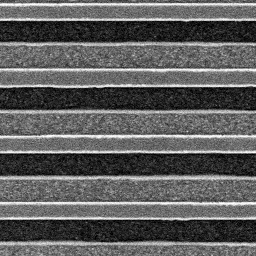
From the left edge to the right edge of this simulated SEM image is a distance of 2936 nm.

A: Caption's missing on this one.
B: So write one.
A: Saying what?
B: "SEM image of lines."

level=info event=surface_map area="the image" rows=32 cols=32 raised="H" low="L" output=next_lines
HHHHHHHHHHHHHHHHHHHHHHHHHHHHHHHH
HHHHHHHHHHHHHHHHHHHHHHHHHHHHHHHH
HHHHHHHHHHHHHHHHHHHHHHHHHHHHHHHH
LLLLLLLLLLLLLLLLLLLLLLLLLLLLLLLL
LLLLLLLLLLLLLLLLLLLLLLLLLLLLLLLL
LLLLLLLLLLLLLLLLLLLLLLLLLLLLLLLL
HHHHHHHHHHHHHHHHHHHHHHHHHHHHHHHH
HHHHHHHHHHHHHHHHHHHHHHHHHHHHHHHH
HHHHHHHHHHHHHHHHHHHHHHHHHHHHHHHH
HHHHHHHHHHHHHHHHHHHHHHHHHHHHHHHH
HHHHHHHHHHHHHHHHHHHHHHHHHHHHHHHH
LLLLLLLLLLLLLLLLLLLLLLLLLLLLLLLL
LLLLLLLLLLLLLLLLLLLLLLLLLLLLLLLL
LLLLLLLLLLLLLLLLLLLLLLLLLLLLLLLL
HHHHHHHHHHHHHHHHHHHHHHHHHHHHHHHH
HHHHHHHHHHHHHHHHHHHHHHHHHHHHHHHH
HHHHHHHHHHHHHHHHHHHHHHHHHHHHHHHH
HHHHHHHHHHHHHHHHHHHHHHHHHHHHHHHH
HHHHHHHHHHHHHHHHHHHHHHHHHHHHHHHH
LLLLLLLLLLLLLLLLLLLLLLLLLLLLLLLL
LLLLLLLLLLLLLLLLLLLLLLLLLLLLLLLL
LLLLLLLLLLLLLLLLLLLLLLLLLLLLLLLL
HHHHHHHHHHHHHHHHHHHHHHHHHHHHHHHH
HHHHHHHHHHHHHHHHHHHHHHHHHHHHHHHH
HHHHHHHHHHHHHHHHHHHHHHHHHHHHHHHH
HHHHHHHHHHHHHHHHHHHHHHHHHHHHHHHH
HHHHHHHHHHHHHHHHHHHHHHHHHHHHHHHH
LLLLLLLLLLLLLLLLLLLLLLLLLLLLLLLL
LLLLLLLLLLLLLLLLLLLLLLLLLLLLLLLL
LLLLLLLLLLLLLLLLLLLLLLLLLLLLLLLL
HHLLLLLLLLLLLLLLLLLLLLLLLLLLLLLL
HHHHHHHHHHHHHHHHHHHHHHHHHHHHHHHH